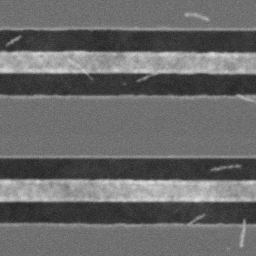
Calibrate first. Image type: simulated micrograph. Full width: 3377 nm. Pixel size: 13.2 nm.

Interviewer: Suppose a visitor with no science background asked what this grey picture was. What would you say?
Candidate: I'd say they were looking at lines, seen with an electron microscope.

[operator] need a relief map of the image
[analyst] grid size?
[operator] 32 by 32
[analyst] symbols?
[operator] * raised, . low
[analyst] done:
********************************
********************************
********************************
********************************
................................
................................
.........**.....................
********************************
********************************
................................
................................
................................
********************************
********************************
********************************
********************************
********************************
********************************
********************************
********************************
................................
................................
*****.*****.**..................
********************************
********************************
................................
................................
................................
********************************
********************************
********************************
********************************